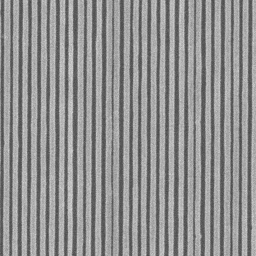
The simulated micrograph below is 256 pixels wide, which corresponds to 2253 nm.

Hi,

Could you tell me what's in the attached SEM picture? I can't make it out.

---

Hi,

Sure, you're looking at parallel lines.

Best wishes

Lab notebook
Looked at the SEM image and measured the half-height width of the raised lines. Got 5.25 pixels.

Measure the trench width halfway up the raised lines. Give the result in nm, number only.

38.5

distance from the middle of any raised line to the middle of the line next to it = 80.6 nm